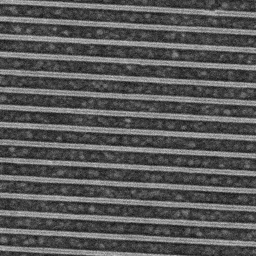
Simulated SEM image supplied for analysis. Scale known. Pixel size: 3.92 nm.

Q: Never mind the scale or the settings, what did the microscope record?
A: parallel lines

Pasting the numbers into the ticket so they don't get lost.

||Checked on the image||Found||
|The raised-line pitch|17.6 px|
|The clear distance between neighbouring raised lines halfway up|52.4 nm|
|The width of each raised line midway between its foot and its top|14.2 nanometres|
